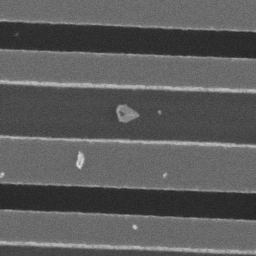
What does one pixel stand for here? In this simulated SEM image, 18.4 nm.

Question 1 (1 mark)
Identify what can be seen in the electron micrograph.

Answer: lines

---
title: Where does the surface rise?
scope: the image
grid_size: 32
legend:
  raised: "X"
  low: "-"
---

XXXXXXXXXXXXXXXXXXXXXXXXXXXXXXXX
XXXXXXXXXXXXXXXXXXXXXXXXXXXXXXXX
XXXXXXXXXXXXXXXXXXXXXXXXXXXXXXXX
----------------------XXXXXXXXXX
--------------------------------
--------------------------------
XXXXXXX-------------------------
XXXXXXXXXXXXXXXXXXXXXXXXXXXXXXXX
XXXXXXXXXXXXXXXXXXXXXXXXXXXXXXXX
XXXXXXXXXXXXXXXXXXXXXXXXXXXXXXXX
----------XXXXXXXXXXXXXXXXXXXXXX
--------------------------------
--------------------------------
--------------------------------
--------------------------------
--------------------------------
--------------------------------
XXXXXXXXXX----------------------
XXXXXXXXXXXXXXXXXXXXXXXXXXXXXXXX
XXXXXXXXXXXXXXXXXXXXXXXXXXXXXXXX
XXXXXXXXXXXXXXXXXXXXXXXXXXXXXXXX
XXXXXXXXXXXXXXXXXXXXXXXXXXXXXXXX
XXXXXXXXXXXXXXXXXXXXXXXXXXXXXXXX
-----------------XXXXXXXXXXXXXXX
--------------------------------
--------------------------------
XXXXX---------------------------
XXXXXXXXXXXXXXXXXXXXXXXXXXXX----
XXXXXXXXXXXXXXXXXXXXXXXXXXXXXXXX
XXXXXXXXXXXXXXXXXXXXXXXXXXXXXXXX
------XXXXXXXXXXXXXXXXXXXXXXXXXX
--------------------------------